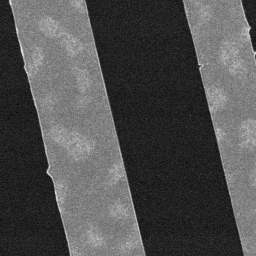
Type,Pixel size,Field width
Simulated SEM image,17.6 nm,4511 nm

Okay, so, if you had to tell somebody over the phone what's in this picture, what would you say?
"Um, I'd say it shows one or a few lines or trenches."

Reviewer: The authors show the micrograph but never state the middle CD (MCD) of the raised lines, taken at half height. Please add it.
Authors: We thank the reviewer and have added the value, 1280 nm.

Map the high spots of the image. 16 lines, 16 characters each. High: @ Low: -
-@@@@-------@@@-
-@@@@@------@@@-
-@@@@@------@@@@
-@@@@@------@@@@
--@@@@-------@@@
--@@@@@------@@@
--@@@@@------@@@
--@@@@@------@@@
---@@@@-------@@
---@@@@@------@@
---@@@@@------@@
---@@@@@------@@
----@@@@------@@
----@@@@-------@
----@@@@@------@
----@@@@@------@